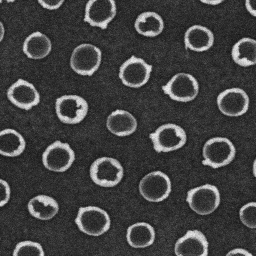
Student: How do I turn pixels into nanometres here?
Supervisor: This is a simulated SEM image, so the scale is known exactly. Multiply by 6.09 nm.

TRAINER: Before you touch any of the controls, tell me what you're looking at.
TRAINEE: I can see a regular array of raised bodies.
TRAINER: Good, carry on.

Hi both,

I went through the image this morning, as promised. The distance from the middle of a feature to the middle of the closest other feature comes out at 0.303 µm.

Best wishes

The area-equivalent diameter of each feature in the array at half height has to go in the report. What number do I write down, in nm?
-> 184